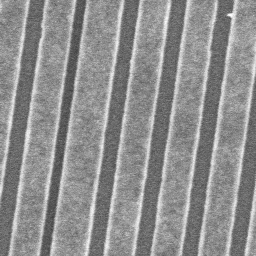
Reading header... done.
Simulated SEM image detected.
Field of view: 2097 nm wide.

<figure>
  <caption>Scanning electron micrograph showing parallel lines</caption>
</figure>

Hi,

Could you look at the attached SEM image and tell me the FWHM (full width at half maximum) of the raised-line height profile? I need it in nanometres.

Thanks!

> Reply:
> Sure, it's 248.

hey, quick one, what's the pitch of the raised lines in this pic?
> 383 nm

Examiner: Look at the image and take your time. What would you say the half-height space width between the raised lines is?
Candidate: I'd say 0.14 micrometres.